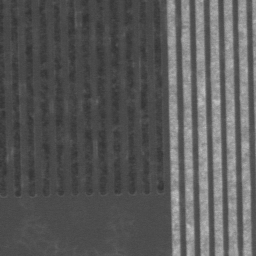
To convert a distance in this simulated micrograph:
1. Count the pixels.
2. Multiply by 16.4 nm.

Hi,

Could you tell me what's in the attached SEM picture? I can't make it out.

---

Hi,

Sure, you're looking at parallel lines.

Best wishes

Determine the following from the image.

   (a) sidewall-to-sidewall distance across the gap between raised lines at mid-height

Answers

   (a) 102 nanometres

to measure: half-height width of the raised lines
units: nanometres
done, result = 127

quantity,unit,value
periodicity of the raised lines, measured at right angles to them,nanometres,233